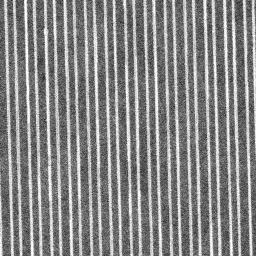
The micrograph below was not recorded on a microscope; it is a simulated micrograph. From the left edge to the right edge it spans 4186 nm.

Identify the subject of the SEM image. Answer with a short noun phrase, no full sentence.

parallel lines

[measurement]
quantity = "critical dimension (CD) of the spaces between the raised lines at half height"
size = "114 nm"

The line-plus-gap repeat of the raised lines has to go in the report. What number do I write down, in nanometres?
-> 162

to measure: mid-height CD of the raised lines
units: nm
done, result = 32.7